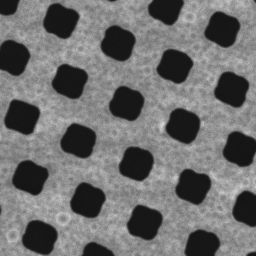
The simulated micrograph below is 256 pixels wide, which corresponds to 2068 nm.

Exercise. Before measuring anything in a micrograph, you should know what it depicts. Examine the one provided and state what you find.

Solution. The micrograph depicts a regular array of holes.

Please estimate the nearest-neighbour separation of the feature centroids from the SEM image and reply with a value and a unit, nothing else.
487 nanometers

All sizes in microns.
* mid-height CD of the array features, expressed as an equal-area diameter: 0.278